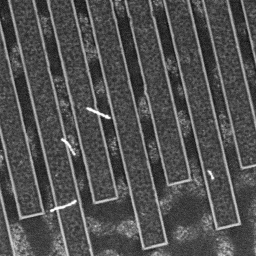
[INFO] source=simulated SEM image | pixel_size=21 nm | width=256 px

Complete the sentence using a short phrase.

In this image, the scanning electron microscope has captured parallel lines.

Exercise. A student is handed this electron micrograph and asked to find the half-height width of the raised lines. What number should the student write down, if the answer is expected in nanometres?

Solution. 504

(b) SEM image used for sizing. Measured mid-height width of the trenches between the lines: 302 nm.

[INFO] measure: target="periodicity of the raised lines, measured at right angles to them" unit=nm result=794